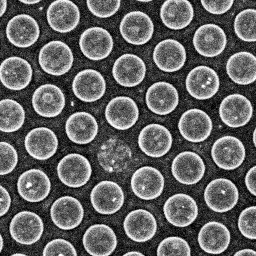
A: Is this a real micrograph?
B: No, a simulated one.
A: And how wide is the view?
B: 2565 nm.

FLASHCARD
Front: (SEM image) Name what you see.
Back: a regular array of raised bodies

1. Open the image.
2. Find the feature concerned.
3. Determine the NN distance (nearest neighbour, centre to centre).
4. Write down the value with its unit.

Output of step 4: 429 nanometres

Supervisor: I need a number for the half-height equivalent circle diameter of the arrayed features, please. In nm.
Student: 319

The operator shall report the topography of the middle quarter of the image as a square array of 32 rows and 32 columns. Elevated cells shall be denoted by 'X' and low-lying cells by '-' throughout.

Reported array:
XX-----------XXXXXXX----XXXXX---
X-----------XXXXXXXX-----XXX----
----XXXXX---XXXXXXXX-----------X
---XXXXXXX---XXXXXXX-----------X
--XXXXXXXX----XXXXX------------X
--XXXXXXXX------------XXXXX----X
--XXXXXXXX-----------XXXXXXX---X
---XXXXXXX-----------XXXXXXX----
----XXXXX----XXX-----XXXXXXX----
------------XXXXX----XXXXXXX----
-----------XXXXXXX---XXXXXXX----
-----------XXXXXXX----XXXXX-----
---XXX----XXXXXXXX------------XX
-XXXXXX----XXXXXXX-----------XXX
-XXXXXXX---XXXXXXX-----------XXX
-XXXXXXX----XXXXX----XXX-----XXX
-XXXXXXX------------XXXXXX---XXX
-XXXXXXX-----------XXXXXXX---XXX
-XXXXXX------------XXXXXXXX---XX
---XXX-------------XXXXXXXX-----
-------------------XXXXXXXX-----
--------------------XXXXXX------
---------------------XXXX----XXX
XXXXX-----------------------XXXX
XXXXXX---------------------XXXXX
XXXXXX---------------------XXXXX
XXXXXXX------------XXXX----XXXXX
XXXXXX------------XXXXXX---XXXXX
XXXXXX-----------XXXXXXXX---XXXX
XXXXX-----XX-----XXXXXXXX----XXX
--XX----XXXXXX---XXXXXXXX-------
-------XXXXXXX---XXXXXXX--------